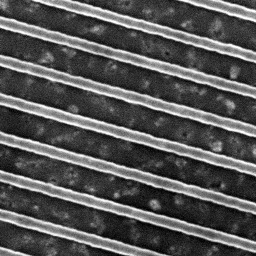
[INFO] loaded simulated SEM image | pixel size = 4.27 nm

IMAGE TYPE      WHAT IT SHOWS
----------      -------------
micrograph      parallel lines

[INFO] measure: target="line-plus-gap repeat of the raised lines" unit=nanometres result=157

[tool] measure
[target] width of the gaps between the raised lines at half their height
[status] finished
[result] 119 nanometres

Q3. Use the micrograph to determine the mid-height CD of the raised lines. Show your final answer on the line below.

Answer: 39.6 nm